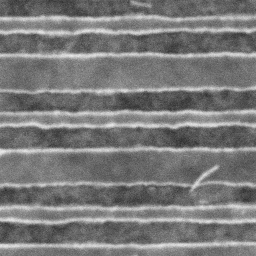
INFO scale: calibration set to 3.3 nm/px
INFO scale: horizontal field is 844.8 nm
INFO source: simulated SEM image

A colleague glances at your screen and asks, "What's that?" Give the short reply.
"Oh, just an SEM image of lines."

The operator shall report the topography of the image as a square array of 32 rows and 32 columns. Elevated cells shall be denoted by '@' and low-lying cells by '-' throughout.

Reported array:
--------------------------------
--------------------------------
@@@@@@@@@@@@@@@@@@@@@@@@@@@@@@@@
@@@@@@@@@@@@@@@@@@@@@@@@@@@@@@@@
--------------------------------
--------------------------------
--------------------------------
@@@@@@@@@@@@@@@@@@@@@@@@@@@@@@@@
@@@@@@@@@@@@@@@@@@@@@@@@@@@@@@@@
@@@@@@@@@@@@@@@@@@@@@@@@@@@@@@@@
@@@@@@@@@@@@@@@@@@@@@@@@@@@@@@@@
-@@@@@@@@@--@--@----------------
--------------------------------
--------------------------------
@@@@@@@@@@@@@@@@@@@@@@@@@@@@@@@@
@@@@@@@@@@@@@@@@@@@@@@@@@@@@@@@@
--------------------------------
--------------------------------
--------------------------------
@@@@@@@@@@@@@@@@@@@@@@@@@@@@@@@@
@@@@@@@@@@@@@@@@@@@@@@@@@@@@@@@@
@@@@@@@@@@@@@@@@@@@@@@@@@@@@@@@@
@@@@@@@@@@@@@@@@@@@@@@@@@@@@@@@@
--------------------------------
--------------------------------
--------------------------------
@@@@@@@@@@@@@@@@@@@@@@@@@@@@@@@@
@@@@@@@@@@@@@@@@@@@@@@@@@@@@@@@@
--------------------------------
--------------------------------
--------------------@@@@@@@@@@@@
@@@@@@@@@@@@@@@@@@@@@@@@@@@@@@@@